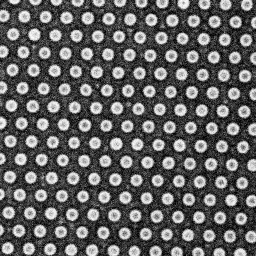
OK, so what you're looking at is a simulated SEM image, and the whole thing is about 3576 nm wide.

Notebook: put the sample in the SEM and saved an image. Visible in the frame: a regular array of raised bodies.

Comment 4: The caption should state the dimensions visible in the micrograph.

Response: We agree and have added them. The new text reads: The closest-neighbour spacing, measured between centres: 285 nanometres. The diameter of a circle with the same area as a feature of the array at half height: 146 nanometers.